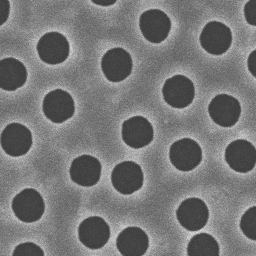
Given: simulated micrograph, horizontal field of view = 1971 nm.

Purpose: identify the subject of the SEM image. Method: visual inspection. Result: a regular array of holes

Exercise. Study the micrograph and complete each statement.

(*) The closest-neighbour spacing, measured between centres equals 54.6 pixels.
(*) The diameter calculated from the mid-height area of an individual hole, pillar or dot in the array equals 255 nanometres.